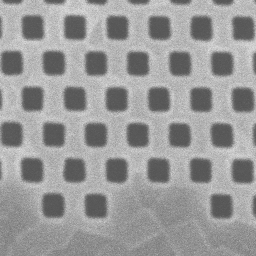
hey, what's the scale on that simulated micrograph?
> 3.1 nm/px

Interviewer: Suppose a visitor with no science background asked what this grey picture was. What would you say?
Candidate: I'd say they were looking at a regular array of holes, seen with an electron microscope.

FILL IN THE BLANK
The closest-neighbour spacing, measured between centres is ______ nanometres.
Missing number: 128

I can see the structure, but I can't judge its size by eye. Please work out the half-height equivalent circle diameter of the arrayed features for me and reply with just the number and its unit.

78.9 nm